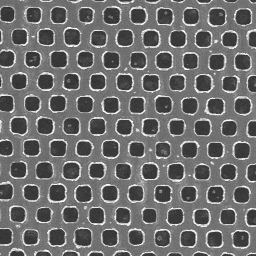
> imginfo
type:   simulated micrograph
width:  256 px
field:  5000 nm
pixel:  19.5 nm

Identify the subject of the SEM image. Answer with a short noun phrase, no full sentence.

a regular array of holes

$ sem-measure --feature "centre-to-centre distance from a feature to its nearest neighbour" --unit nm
496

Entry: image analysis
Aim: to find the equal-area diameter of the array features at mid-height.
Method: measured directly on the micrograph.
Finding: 325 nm